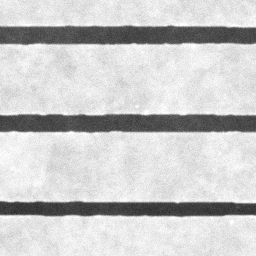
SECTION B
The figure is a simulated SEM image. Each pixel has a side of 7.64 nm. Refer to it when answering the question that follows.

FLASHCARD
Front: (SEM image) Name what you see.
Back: lines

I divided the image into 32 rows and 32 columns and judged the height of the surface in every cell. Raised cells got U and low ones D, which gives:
UUUUUUUUUUUUUUUUUUUUUUUUUUUUUUUU
UUUUUUUUUUUUUUUUUUUUUUUUUUUUUUUU
UUUUUUUUUUUUUUUUUUUUUUUUUUUUUUUU
DDDDDDDDDDDDDDDDDDDDDDDDDDDDDDDD
DDDDDDDDDDDDDDDDDDDDDDDDDDDDDDDD
DDDDDDDDDDDDDDDDDDDDDDDDDDDDDDDD
UUUUUUUUUUUUUUUUUUUUUUUUUUUUUUUU
UUUUUUUUUUUUUUUUUUUUUUUUUUUUUUUU
UUUUUUUUUUUUUUUUUUUUUUUUUUUUUUUU
UUUUUUUUUUUUUUUUUUUUUUUUUUUUUUUU
UUUUUUUUUUUUUUUUUUUUUUUUUUUUUUUU
UUUUUUUUUUUUUUUUUUUUUUUUUUUUUUUU
UUUUUUUUUUUUUUUUUUUUUUUUUUUUUUUU
UUUUUUUUUUUUUUUUUUUUUUUUUUUUUUUU
DDDDDDDDDDDDDDDDDDDDDDDDDDDDDDDD
DDDDDDDDDDDDDDDDDDDDDDDDDDDDDDDD
DUUUDDDDUUDDDUUUDDDDDDDDDDUDUUDD
UUUUUUUUUUUUUUUUUUUUUUUUUUUUUUUU
UUUUUUUUUUUUUUUUUUUUUUUUUUUUUUUU
UUUUUUUUUUUUUUUUUUUUUUUUUUUUUUUU
UUUUUUUUUUUUUUUUUUUUUUUUUUUUUUUU
UUUUUUUUUUUUUUUUUUUUUUUUUUUUUUUU
UUUUUUUUUUUUUUUUUUUUUUUUUUUUUUUU
UUUUUUUUUUUUUUUUUUUUUUUUUUUUUUUU
UUUUUUUUUUUUUUUUUUUUUUUUUUUUUUUU
DDDDDDDDDDDDDDDDDDDDDDDDDDDDDDDD
DDDDDDDDDDDDDDDDDDDDDDDDDDDDDDDD
UUUUUUUUUUUUUUUUUUUUUUUUUUUUUUUU
UUUUUUUUUUUUUUUUUUUUUUUUUUUUUUUU
UUUUUUUUUUUUUUUUUUUUUUUUUUUUUUUU
UUUUUUUUUUUUUUUUUUUUUUUUUUUUUUUU
UUUUUUUUUUUUUUUUUUUUUUUUUUUUUUUU